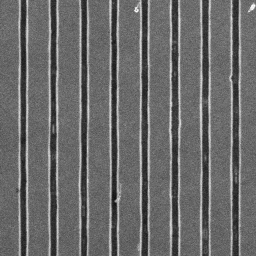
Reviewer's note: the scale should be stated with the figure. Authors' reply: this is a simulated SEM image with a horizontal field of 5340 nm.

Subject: parallel lines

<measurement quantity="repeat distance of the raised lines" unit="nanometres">635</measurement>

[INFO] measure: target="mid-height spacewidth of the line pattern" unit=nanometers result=154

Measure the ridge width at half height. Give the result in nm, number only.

485